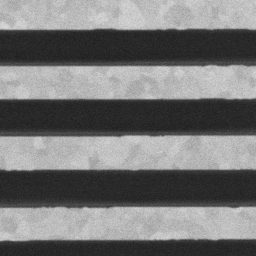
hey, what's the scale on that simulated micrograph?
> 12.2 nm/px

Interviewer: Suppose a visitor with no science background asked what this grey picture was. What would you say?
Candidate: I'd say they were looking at lines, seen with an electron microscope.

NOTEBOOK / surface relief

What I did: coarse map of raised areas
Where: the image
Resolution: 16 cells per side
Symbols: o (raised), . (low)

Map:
oooooooooooooooo
oooooooooooooooo
................
................
oooooooooooooooo
oooooooooooooooo
................
................
oooooooooooooooo
oooooooooooooooo
oooooooooooooooo
................
................
oooooooooooooooo
oooooooooooooooo
................